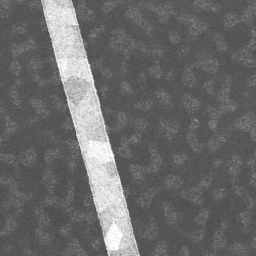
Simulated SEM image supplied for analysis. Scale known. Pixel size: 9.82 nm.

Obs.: one or a few lines or trenches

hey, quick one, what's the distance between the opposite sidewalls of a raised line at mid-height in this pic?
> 286 nm